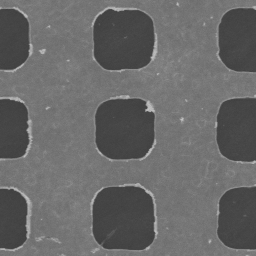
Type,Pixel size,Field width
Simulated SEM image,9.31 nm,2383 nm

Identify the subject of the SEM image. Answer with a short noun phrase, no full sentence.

holes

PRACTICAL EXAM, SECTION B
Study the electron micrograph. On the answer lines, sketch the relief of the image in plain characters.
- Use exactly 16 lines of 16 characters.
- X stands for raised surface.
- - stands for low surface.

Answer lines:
XXXXXXXXXXXXXXXX
--XXXX----XXXX--
--XXXX----XXXX--
--XXXX---XXXXX--
XXXXXXXXXXXXXXXX
XXXXXXXXXXXXXXXX
-XXXXX---XXXXX--
--XXXX----XXXX--
--XXXX----XXXX--
--XXXX---XXXXX--
XXXXXXXXXXXXXXXX
XXXXXXXXXXXXXXXX
--XXXX---XXXXX--
--XXXX----XXXX--
--XXXX----XXXX--
-XXXXXX--XXXXXX-